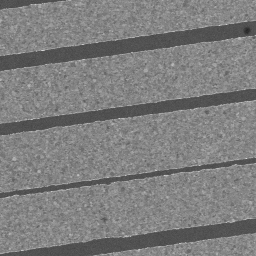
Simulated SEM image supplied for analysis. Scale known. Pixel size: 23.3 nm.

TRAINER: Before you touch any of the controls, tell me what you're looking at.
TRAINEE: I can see one or a few lines or trenches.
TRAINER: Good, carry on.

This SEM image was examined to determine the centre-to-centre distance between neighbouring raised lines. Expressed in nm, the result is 1490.